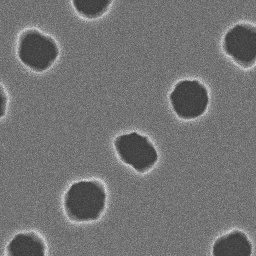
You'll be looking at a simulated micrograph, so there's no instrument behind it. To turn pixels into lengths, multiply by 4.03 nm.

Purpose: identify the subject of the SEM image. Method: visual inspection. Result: holes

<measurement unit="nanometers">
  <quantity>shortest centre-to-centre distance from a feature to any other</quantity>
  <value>293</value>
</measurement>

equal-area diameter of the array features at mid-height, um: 0.154